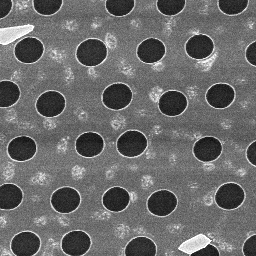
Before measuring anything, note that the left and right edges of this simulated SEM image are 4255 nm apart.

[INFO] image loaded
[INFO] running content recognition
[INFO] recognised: a regular array of holes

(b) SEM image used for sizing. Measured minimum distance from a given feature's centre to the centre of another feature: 818 nanometres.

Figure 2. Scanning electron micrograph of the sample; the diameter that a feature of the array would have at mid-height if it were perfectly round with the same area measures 455 nanometres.